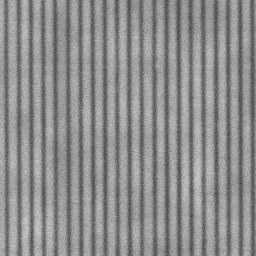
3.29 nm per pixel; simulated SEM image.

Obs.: parallel lines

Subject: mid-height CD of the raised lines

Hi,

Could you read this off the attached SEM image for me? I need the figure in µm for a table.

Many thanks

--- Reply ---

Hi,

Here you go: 0.0275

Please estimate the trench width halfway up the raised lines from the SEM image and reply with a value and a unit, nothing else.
12.3 nm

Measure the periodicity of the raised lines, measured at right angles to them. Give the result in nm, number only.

40.5